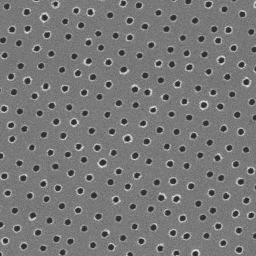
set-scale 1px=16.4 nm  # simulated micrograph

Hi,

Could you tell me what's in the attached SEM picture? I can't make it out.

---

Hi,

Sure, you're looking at a regular array of holes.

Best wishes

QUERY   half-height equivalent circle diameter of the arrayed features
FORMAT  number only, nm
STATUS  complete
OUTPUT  103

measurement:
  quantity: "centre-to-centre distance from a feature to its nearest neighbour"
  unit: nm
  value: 259